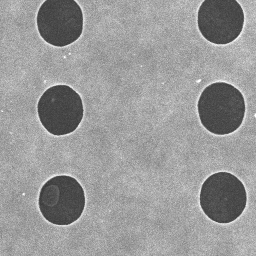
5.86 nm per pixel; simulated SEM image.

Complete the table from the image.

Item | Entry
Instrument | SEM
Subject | holes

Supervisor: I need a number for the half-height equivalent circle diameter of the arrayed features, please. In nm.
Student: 285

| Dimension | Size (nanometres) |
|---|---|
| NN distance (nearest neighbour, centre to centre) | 526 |